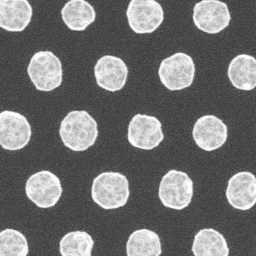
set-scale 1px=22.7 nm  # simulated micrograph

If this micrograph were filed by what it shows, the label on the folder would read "a regular array of raised bodies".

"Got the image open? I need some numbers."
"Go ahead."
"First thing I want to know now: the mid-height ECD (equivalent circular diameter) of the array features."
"781 nm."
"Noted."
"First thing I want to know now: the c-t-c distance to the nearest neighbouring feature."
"1500 nm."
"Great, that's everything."